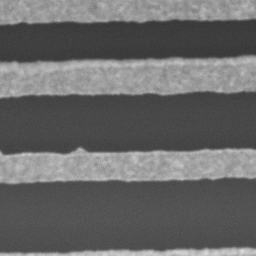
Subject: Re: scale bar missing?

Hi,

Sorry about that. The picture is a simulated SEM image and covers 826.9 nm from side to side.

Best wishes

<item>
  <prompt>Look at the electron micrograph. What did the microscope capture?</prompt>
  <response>lines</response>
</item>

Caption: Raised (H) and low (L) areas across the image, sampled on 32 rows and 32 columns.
HHHHHHHHHHHHHHHHHHHHHHHHHHHHHHHH
HHHHHHHHHHHHHHHHHHHHHHHHHHHHHHHH
HHHHHHHHHHHHHHHHHHHHHLLLHHHHLLLL
LLLLLLLLLLLLLLLLLLLLLLLLLLLLLLLL
LLLLLLLLLLLLLLLLLLLLLLLLLLLLLLLL
LLLLLLLLLLLLLLLLLLLLLLLLLLLLLLLL
LLLLLLLLLLLLLLLLLLLLLLLLLLLLLLLL
LLLLLLLLLLLLLLLLLLHLLHHHHHHHHHHH
HHHHHHHHHHHHHHHHHHHHHHHHHHHHHHHH
HHHHHHHHHHHHHHHHHHHHHHHHHHHHHHHH
HHHHHHHHHHHHHHHHHHHHHHHHHHHHHHHH
HHHHHHHHHHHHHHHHHHHHHHHHLLLLHLLL
LLLLLLLLLLLLLLLLLLLLLLLLLLLLLLLL
LLLLLLLLLLLLLLLLLLLLLLLLLLLLLLLL
LLLLLLLLLLLLLLLLLLLLLLLLLLLLLLLL
LLLLLLLLLLLLLLLLLLLLLLLLLLLLLLLL
LLLLLLLLLLLLLLLLLLLLLLLLLLLLLLLL
LLLLLLLLLLLLLLLLLLLLLLLLLLLLLLLL
LLLLLLLLLLLLLLLLLLLLLLLLLLLLLLLL
HHHHHHHHHHHHHHHHHHHHHHHHHHHHHHHH
HHHHHHHHHHHHHHHHHHHHHHHHHHHHHHHH
HHHHHHHHHHHHHHHHHHHHHHHHHHHHHHHH
HHHHHHHHHHHHHHLHHHHHHLLLLLLLLLLL
LLLLLLLLLLLLLLLLLLLLLLLLLLLLLLLL
LLLLLLLLLLLLLLLLLLLLLLLLLLLLLLLL
LLLLLLLLLLLLLLLLLLLLLLLLLLLLLLLL
LLLLLLLLLLLLLLLLLLLLLLLLLLLLLLLL
LLLLLLLLLLLLLLLLLLLLLLLLLLLLLLLL
LLLLLLLLLLLLLLLLLLLLLLLLLLLLLLLL
LLLLLLLLLLLLLLLLLLLLLLLLLLLLLLLL
LLLLLLLLLLLLLLLLLLLLLLLLLLLLLLLL
LLLLLLLLLLLLLLLLLLHLLHHHHHHHHHHH